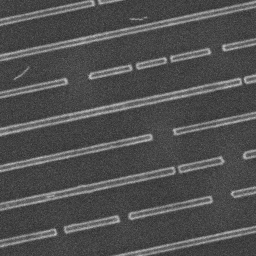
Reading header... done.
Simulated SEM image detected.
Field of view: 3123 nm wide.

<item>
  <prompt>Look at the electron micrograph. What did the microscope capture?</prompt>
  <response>parallel lines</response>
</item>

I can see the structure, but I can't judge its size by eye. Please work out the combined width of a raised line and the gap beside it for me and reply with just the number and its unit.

444 nm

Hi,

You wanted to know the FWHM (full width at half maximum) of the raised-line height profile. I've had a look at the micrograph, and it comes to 68.6 nanometers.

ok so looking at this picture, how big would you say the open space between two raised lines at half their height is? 370 nanometers